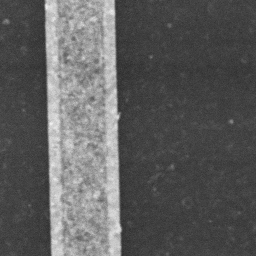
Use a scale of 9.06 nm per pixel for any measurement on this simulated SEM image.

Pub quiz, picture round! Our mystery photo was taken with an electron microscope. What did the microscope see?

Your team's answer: one or a few lines or trenches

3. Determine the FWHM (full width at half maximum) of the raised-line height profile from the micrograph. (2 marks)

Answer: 536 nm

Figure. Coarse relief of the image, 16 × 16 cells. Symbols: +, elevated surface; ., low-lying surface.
...++++.........
...++++.........
...++++.........
...++++.........
...++++.........
...++++.........
...++++.........
...++++.........
...++++.........
...++++.........
...++++.........
...++++.........
...++++.........
...++++.........
....+++.........
....+++.........